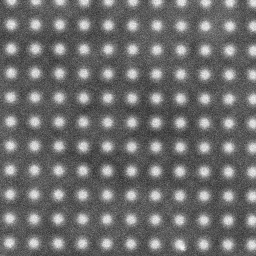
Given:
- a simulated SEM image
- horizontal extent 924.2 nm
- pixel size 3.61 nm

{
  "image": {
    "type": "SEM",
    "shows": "an array of small figures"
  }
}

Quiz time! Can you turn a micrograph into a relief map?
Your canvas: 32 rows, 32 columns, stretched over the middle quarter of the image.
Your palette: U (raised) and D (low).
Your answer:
DDDDUUDDDDUUDDDDDDDDDDDDDDDDDDDD
UDDUUUUDDUUUUDDUUUUDDUUUUDDUUUUD
UDDUUUUDDUUUUDDUUUUDDUUUUDDUUUUD
UDDUUUUDDUUUUDDUUUUDDUUUUDDUUUUD
DDDDDDDDDDUUDDDDUUDDDDUUDDDDUUDD
DDDDDDDDDDDDDDDDDDDDDDDDDDDDDDDD
DDDDUUDDDDUUDDDDDDDDDDDDDDDDDDDD
UDDUUUUDDUUUUDDUUUUDDUUUUDDUUUUD
UDDUUUUDDUUUUDDUUUUDDUUUUDDUUUUD
UDDUUUUDDUUUUDDUUUUDDUUUUDDUUUUD
DDDDUDDDDDUUDDDDUUDDDDUUDDDDUUDD
DDDDDDDDDDDDDDDDDDDDDDDDDDDDDDDD
DDDDDDDDDDDDDDDDDUDDDDDDDDDDDDDD
UDDUUUUDDUUUUDDUUUUDDUUUUDDUUUUD
UDDUUUUDDUUUUDDUUUUDDUUUUDDUUUUD
UDDUUUUDDUUUUDDUUUUDDUUUUDDUUUUD
DDDDUUDDDDUUDDDDUUDDDDUUDDDDUUDD
DDDDDDDDDDDDDDDDDDDDDDDDDDDDDDDD
DDDDDDDDDDDDDDDDDDDDDDDDDDDDDDDD
UDDUUUUDDUUUUDDUUUUDDUUUUDDUUUUD
UDDUUUUDDUUUUDDUUUUDDUUUUDDUUUUD
UDDUUUUDDUUUUDDUUUUDDUUUUDDUUUUD
DDDDUUDDDDUUDDDDUUDDDDUUDDDDUUDD
DDDDDDDDDDDDDDDDDDDDDDDDDDDDDDDD
DDDDDDDDDDDDDDDDDDDDDDDDDDDDDDDD
DDDUUUDDDUUUUDDUUUDDDUUUUDDUUUUD
UDDUUUUDDUUUUDDUUUUDDUUUUDDUUUUD
DDDUUUUDDUUUUDDUUUUDDUUUUDDUUUUD
DDDDUUDDDDUUDDDDUUDDDDUUDDDDUUDD
DDDDDDDDDDDDDDDDDDDDDDDDDDDDDDDD
DDDDDDDDDDDDDDDDDDDDDDDDDDDDDDDD
DDDUUUDDDUUUDDDUUUDDDUUUDDDDUUDD